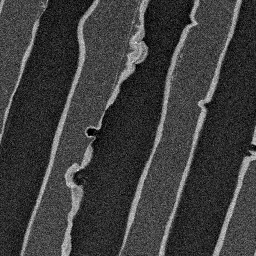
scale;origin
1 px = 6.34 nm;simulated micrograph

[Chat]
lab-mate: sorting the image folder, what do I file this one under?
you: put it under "one or a few lines or trenches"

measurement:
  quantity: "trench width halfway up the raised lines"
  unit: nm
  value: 336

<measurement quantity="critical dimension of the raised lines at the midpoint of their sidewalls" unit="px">39.9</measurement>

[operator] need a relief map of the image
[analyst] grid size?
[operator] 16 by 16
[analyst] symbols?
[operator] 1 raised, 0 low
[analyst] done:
1110001110001110
1100011110001110
1100011110011100
1100011110011100
1000011100011100
1000011000011000
1000111000111000
0000110000111000
0000110000110000
0001100000110000
0001100001110001
0001100001100001
0011100001100001
0011100011100011
0011000011000011
0011000011000011